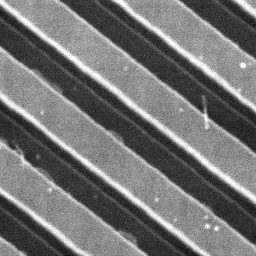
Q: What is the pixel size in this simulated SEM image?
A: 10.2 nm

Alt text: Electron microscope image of lines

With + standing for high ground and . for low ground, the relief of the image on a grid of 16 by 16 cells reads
++++....++++...+
..++++...++++...
...++++...++++..
+...++++....++++
++...++++....+++
+++....++++...++
+++++...++++...+
..++++...++++...
...++++....++++.
+...++++....++++
++....++++...+++
+++....++++...++
.++++...++++....
..++++...+++++..
...++++....++++.
+...+++++...++++